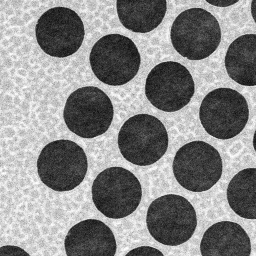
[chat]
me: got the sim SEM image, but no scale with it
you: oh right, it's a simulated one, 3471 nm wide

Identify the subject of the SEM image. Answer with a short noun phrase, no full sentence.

a regular array of holes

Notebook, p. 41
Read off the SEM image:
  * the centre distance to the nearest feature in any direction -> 799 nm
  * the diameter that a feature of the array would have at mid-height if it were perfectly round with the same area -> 693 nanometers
